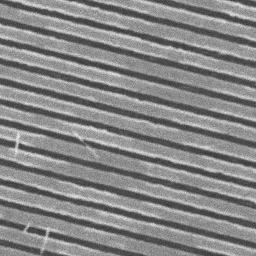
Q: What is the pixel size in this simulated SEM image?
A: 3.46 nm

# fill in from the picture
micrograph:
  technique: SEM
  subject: parallel lines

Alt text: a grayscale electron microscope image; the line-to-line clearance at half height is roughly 21.8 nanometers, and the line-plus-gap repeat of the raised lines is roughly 0.0675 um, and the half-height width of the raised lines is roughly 43.3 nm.